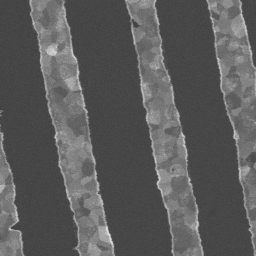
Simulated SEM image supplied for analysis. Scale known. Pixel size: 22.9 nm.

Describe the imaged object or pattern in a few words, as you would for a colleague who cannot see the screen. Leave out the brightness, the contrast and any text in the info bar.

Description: one or a few lines or trenches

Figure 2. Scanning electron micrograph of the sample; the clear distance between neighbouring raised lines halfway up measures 1.28 microns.